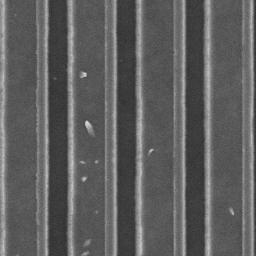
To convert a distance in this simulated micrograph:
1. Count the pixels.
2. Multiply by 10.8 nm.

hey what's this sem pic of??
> lines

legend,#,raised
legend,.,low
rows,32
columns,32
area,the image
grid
######...#####...######...######
######...#####...######...######
######...#####...######...######
######...#####...######...######
######...#####...######...######
######...#####...######...######
######...#####...######...######
######...#####...######...######
######...#####...######...######
######...#####...######...######
######...#####...######...######
######...#####...######...######
######...#####...######...######
######...#####...######...######
######...#####...######...######
######...#####...######...#####.
######...#####...######...######
######...#####...######...######
######...#####...######...######
######...#####...######...######
######...#####...######...######
######...#####...######...######
######...#####...######...######
######...#####...######...######
######...#####...######...######
######...#####...######...######
######...#####...######...######
######...#####...######...######
######...#####...######...######
######...#####...######...######
######...#####...######...######
######...#####...######...######